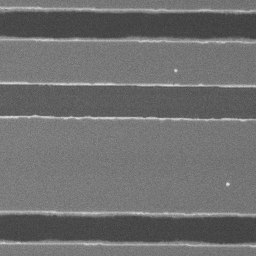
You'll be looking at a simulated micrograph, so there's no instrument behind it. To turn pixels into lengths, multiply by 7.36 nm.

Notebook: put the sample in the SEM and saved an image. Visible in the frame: lines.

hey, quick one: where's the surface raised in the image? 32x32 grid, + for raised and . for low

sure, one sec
++++++++++++++++++++++++++++++++
................................
................................
................................
................................
++++++++++++++++++++++++++++++++
++++++++++++++++++++++++++++++++
++++++++++++++++++++++++++++++++
++++++++++++++++++++++++++++++++
++++++++++++++++++++++++++++++++
......++++++++++++++++++++++++++
................................
................................
................................
....+...........................
++++++++++++++++++++++++++++++++
++++++++++++++++++++++++++++++++
++++++++++++++++++++++++++++++++
++++++++++++++++++++++++++++++++
++++++++++++++++++++++++++++++++
++++++++++++++++++++++++++++++++
++++++++++++++++++++++++++++++++
++++++++++++++++++++++++++++++++
++++++++++++++++++++++++++++++++
++++++++++++++++++++++++++++++++
++++++++++++++++++++++++++++++++
..+..+++++++++++++++++++++++++++
................................
................................
................................
++++++++++++++..................
++++++++++++++++++++++++++++++++